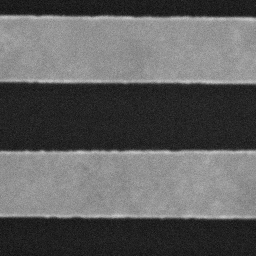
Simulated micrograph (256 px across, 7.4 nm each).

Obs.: lines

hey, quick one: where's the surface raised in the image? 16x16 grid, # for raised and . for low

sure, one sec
................
################
################
################
################
................
................
................
................
################
################
################
################
################
................
................